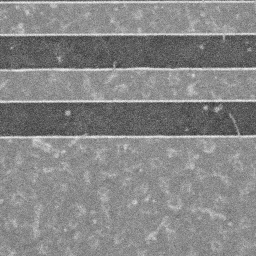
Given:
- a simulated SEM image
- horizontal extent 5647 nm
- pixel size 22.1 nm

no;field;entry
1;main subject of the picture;one or a few lines or trenches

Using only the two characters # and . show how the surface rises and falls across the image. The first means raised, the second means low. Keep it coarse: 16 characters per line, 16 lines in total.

################
################
................
................
################
################
................
................
................
################
################
################
################
################
################
################